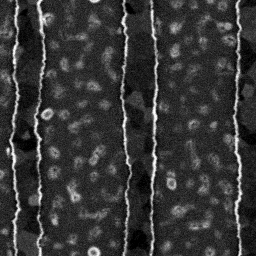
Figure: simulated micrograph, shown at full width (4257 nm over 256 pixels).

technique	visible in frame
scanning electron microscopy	one or a few lines or trenches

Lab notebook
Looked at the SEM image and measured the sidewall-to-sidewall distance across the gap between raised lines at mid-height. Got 84.4 px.